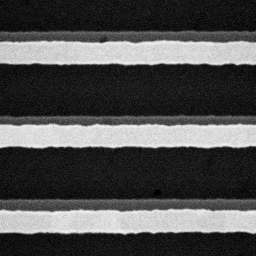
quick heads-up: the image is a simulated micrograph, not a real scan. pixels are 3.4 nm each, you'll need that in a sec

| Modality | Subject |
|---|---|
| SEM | lines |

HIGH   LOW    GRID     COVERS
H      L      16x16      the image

LLLLLLLLLLLLLLLL
LLLLLLLLLLLLLLLL
HHHHHHHHHHHHHHHH
HHHHHHHHHHHHHHHH
LLLLLLLLLLLLLLLL
LLLLLLLLLLLLLLLL
LLLLLLLLLLLLLLLL
HHHHHHHHHHHHHHHH
HHHHHHHHHHHHHHHH
LLLLLLLLLLLLLLLL
LLLLLLLLLLLLLLLL
LLLLLLLLLLLLLLLL
LLLLLLLLLHHLHHLL
HHHHHHHHHHHHHHHH
HHHHHHHHHHHHHHLH
LLLLLLLLLLLLLLLL